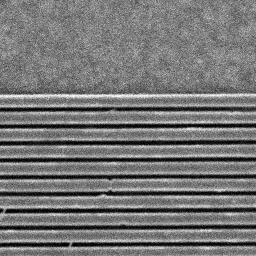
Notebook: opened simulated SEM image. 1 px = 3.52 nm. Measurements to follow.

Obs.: parallel lines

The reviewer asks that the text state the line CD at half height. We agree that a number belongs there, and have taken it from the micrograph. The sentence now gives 39.6 nanometers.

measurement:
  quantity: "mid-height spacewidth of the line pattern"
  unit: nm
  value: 19.8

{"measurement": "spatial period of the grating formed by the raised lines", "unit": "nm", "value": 59.5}